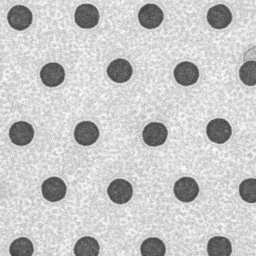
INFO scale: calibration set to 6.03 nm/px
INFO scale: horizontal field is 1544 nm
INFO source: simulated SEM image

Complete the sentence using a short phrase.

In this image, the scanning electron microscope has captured a regular array of holes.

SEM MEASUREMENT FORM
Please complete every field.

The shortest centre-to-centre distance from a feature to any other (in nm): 390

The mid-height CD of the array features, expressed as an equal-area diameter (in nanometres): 159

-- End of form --